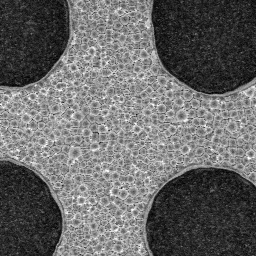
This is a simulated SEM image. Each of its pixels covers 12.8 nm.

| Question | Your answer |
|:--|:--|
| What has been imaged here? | holes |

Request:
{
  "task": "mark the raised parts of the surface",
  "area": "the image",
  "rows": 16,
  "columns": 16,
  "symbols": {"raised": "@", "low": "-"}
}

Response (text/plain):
----@@@@@-------
----@@@@@@------
----@@@@@@------
----@@@@@@------
---@@@@@@@------
-@@@@@@@@@@@---@
@@@@@@@@@@@@@@@@
@@@@@@@@@@@@@@@@
@@@@@@@@@@@@@@@@
@@@@@@@@@@@@@@@@
--@@@@@@@@@@--@@
---@@@@@@@------
---@@@@@@@------
----@@@@@-------
----@@@@@-------
---@@@@@@-------